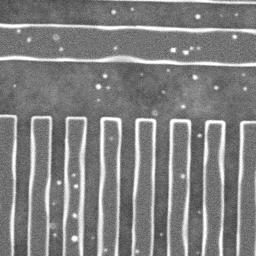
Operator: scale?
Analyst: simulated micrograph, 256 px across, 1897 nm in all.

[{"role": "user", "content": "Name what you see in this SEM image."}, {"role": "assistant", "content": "groups of lines, slits or small figures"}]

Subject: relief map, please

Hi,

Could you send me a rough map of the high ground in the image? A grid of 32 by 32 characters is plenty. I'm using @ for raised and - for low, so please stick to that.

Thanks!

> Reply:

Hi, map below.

--------------------------------
--------------------------------
--------------------------------
@@@@@@@@@@@@@--@@@--------------
@@@@@@@@@@@@@@@@@@@@@@@@@@@@@@@@
@@@@@@@@@@@@@@@@@@@@@@@@@@@@@@@@
@@@@@@@@@@@@@@@@@@@@@@@@@@@@@@@@
------@--@@@@----@@@@@@@@@@@@@@@
--------------------------------
--------------------------------
--------------------------------
--------------------------------
--------------------------------
--------------------------------
@@------------------------------
@@--@@--@@@--@@--@@--@@@--@@--@@
@@--@@--@@@--@@--@@--@@@--@@--@@
@@--@@--@@@--@@--@@--@@@--@@--@@
@@--@@--@@---@@--@@--@@@--@@--@@
@@--@@--@@---@@--@@--@@@--@@--@@
@@--@@--@@---@@--@@--@@@--@@--@@
@@--@@--@@---@@--@@--@@@--@@--@@
@@--@@--@@---@@--@@--@@@--@@--@@
@@--@@--@@---@@--@@--@@@--@@--@@
@@--@@--@@---@@--@@--@@@-@@@--@@
@@--@@--@@---@@--@@--@@--@@@--@@
@@--@@--@@---@@--@@--@@---@@--@@
@@--@@--@@---@@--@@--@@---@@--@@
@---@@--@@---@@--@@--@@---@@--@@
@---@@--@@---@@--@@--@@---@@--@@
@@--@@--@@---@@--@@--@@--@@@--@@
@@--@@--@@--@@@--@@--@@--@@@--@@